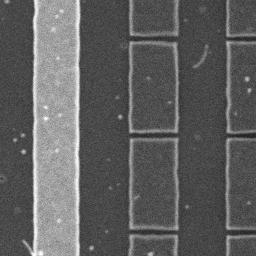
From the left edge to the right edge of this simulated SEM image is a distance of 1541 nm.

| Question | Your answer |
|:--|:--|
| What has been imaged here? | wiring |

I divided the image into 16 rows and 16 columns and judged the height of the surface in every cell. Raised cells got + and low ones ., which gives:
..+++...+++...++
..+++...+++...++
..+++...++....++
..+++...+++...++
..+++...+++...++
..+++...+++...++
..+++...+++...++
..+++...+++...++
..+++...+++...++
..+++...+++...++
..+++...+++...++
..+++...+++...++
..+++...+++...++
..+++...+++...++
..+++.....+....+
..+++...+++...++